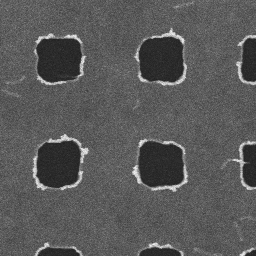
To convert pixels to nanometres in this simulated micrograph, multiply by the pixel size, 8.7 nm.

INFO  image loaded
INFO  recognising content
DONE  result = holes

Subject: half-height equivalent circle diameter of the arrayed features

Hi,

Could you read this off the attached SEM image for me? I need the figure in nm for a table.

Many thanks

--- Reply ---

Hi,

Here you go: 413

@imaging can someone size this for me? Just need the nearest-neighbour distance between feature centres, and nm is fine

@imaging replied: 892